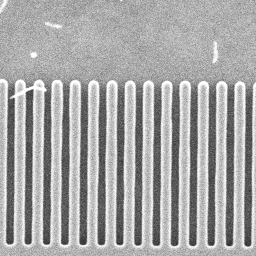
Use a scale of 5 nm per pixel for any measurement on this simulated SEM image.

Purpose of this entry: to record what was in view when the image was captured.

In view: groups of lines, slits or small figures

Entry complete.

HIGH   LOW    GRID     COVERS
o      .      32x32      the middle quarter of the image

................................
................................
................................
................................
..o....o...oo...o....o..........
..oo..ooo..oo..ooo..oo...oo..ooo
..oo..ooo..oo..ooo..oo...oo..ooo
..oo..ooo..oo..ooo..oo...oo..ooo
..oo..ooo..oo..ooo..oo...oo..ooo
..oo..ooo..oo..ooo..oo...oo..ooo
..oo..ooo..oo..ooo..oo...oo..oo.
..oo..ooo..oo..ooo..oo...oo..oo.
..oo..oo...oo..ooo..oo...oo..oo.
..oo..oo...oo..ooo..oo..ooo..oo.
..oo..oo...oo..ooo..oo..ooo..oo.
..oo..oo...oo..ooo..oo..ooo..oo.
..oo..oo...oo..ooo..oo..ooo..oo.
..oo..oo...oo..ooo..oo..ooo..oo.
..oo..oo...oo..oo...oo..ooo..oo.
..oo..oo...oo..oo...oo..ooo..oo.
..oo..oo...oo..ooo..oo..ooo..oo.
..oo..oo...oo..ooo..oo..ooo..oo.
..oo..oo...oo..ooo..oo..ooo..oo.
..oo..ooo..oo..ooo..oo..ooo..oo.
..oo..ooo..oo..ooo..oo..ooo..oo.
..oo..ooo..oo..ooo..oo..ooo..oo.
..oo..oo...oo..ooo..oo..ooo..oo.
..oo..oo...oo..ooo..oo..ooo..oo.
..oo..oo...oo..ooo..oo..ooo..oo.
..oo..oo...oo..oo...oo..ooo..oo.
..oo..oo...oo..oo...oo..ooo..oo.
..oo..oo...oo..oo...oo..ooo..oo.